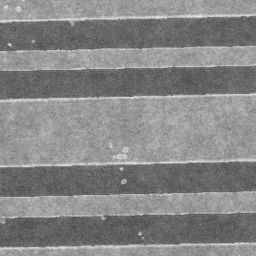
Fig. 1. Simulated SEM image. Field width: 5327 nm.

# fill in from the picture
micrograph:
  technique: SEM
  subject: lines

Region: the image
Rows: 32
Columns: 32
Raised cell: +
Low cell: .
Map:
++++++++++++++++++++++++++++++++
++++++++++++++++++++++++++++++++
+++++...........................
................................
................................
................................
.+++++++++++++++++++++++++++++++
++++++++++++++++++++++++++++++++
+++++++++++.....................
................................
................................
................................
....++++++++++++++++++++++++++++
++++++++++++++++++++++++++++++++
++++++++++++++++++++++++++++++++
++++++++++++++++++++++++++++++++
++++++++++++++++++++++++++++++++
++++++++++++++++++++++++++++++++
++++++++++++++++++++++++++++++++
++++++++++++++++++++++++++++++++
+++++++++++.....................
................................
................................
................................
.............+++++++++++++++++++
++++++++++++++++++++++++++++++++
++++++++++++++++++++++++++++++..
................................
................................
................................
.............................+++
++++++++++++++++++++++++++++++++